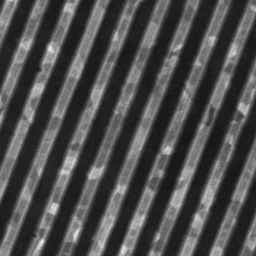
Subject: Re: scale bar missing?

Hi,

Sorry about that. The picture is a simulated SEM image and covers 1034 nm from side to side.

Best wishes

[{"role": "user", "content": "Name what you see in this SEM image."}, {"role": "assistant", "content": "parallel lines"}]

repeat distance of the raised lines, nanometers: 114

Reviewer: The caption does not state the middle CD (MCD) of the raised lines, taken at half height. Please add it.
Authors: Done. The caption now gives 53 nanometers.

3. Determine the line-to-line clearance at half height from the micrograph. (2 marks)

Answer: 0.0634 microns